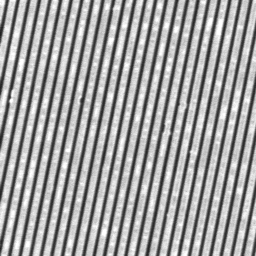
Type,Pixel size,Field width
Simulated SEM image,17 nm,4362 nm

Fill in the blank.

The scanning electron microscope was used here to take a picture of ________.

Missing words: parallel lines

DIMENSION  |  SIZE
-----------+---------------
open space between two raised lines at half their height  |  64.8 nm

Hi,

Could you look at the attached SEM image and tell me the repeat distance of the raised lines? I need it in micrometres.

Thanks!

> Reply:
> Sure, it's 0.177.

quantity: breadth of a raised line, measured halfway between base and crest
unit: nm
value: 113